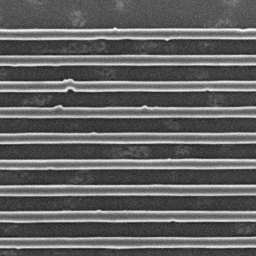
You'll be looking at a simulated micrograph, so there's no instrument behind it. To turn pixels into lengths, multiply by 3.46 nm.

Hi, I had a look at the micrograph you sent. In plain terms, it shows parallel lines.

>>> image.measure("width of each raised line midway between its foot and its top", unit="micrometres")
0.0338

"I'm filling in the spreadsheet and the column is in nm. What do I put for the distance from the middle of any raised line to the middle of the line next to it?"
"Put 90.3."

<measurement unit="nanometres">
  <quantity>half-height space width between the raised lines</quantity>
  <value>55.4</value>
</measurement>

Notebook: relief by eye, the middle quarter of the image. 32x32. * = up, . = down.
................................
................................
................................
................................
***.............................
********************************
*.******************************
................................
................................
................................
................................
********************************
********************************
................................
................................
................................
................................
********************************
********************************
********************************
................................
................................
................................
................................
********************************
********************************
................................
................................
................................
................................
***...........***...*******.....
********************************